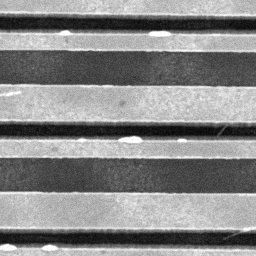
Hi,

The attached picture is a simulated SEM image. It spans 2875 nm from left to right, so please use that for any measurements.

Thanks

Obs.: lines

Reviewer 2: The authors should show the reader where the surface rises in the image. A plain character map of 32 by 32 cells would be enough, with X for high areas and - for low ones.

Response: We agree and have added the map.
XXXXXXXXXXXXXXXXXXXXXXXXXXXXXXXX
XXXXXXXXXXXXXXXXXXXXXXXXXXXXXXXX
--------------------------------
--------------------------------
XXXXXXXXXXXXXXXXXXXXXXXXXXXXXXXX
XXXXXXXXXXXXXXXXXXXXXXXXXXXXXXXX
--------------------------------
--------------------------------
--------------------------------
--------------------------------
--------------------------------
XXXXXXXXXXXXXXXXXXXXXXXXXXXXXXXX
XXXXXXXXXXXXXXXXXXXXXXXXXXXXXXXX
XXXXXXXXXXXXXXXXXXXXXXXXXXXXXXXX
XXXXXXXXXXXXXXXXXXXXXXXXXXXXXXXX
--------------------------------
--------------------------------
XX-X--XXXXX-XX-XXX----XX--------
XXXXXXXXXXXXXXXXXXXXXXXXXXXXXXXX
XXXXXXXXXXXXXXXXXXXXXXXXXXXXXXXX
--------------------------------
--------------------------------
--------------------------------
--------------------------------
XXXXXXXXXXXXXXXXXXXXXXXXXXXXXXXX
XXXXXXXXXXXXXXXXXXXXXXXXXXXXXXXX
XXXXXXXXXXXXXXXXXXXXXXXXXXXXXXXX
XXXXXXXXXXXXXXXXXXXXXXXXXXXXXXXX
XXXXXXXXXXXXXXXXXXXXXXXXXXXXXXXX
--------------------------------
--------------------------------
XXXXXXXXXXXXXXXXXXXXXXXXXXXXXXXX